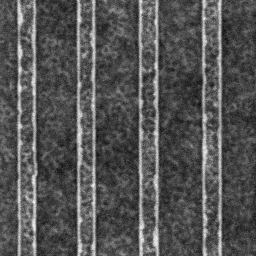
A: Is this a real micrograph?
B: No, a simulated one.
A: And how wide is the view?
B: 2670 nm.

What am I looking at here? parallel lines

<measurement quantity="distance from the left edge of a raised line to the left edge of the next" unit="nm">645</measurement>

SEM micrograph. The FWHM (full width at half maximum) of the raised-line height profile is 0.175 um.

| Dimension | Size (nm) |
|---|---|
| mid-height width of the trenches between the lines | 481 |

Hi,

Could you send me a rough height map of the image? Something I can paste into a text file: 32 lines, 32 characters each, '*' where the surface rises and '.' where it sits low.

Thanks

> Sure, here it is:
..**......**......**.....**.....
..**......**......**.....**.....
..**......**......**......*.....
..**......**......**......*.....
..**......**......**.....**.....
..**......**......**.....**.....
..**......**......**.....**.....
..**......**......**.....***....
..**......**......**......**....
..**......**......**......**....
..**......**......**......**....
..**......**......**.....***....
..**......**......**.....***....
..**......**......**.....***....
..**......**......**.....***....
..**......**......**.....***....
..**......**......**......**....
..**......**......**......**....
..**......**......**.....***....
..**......**......**.....***....
..**......**......**.....***....
..***.....**......**.....***....
..**......**......**.....***....
..**......**......**.....***....
..**......**......**.....***....
..**......**......**.....***....
..**......**......**.....***....
..**......**......**......**....
..**......**.....***......**....
..**......**.....***......**....
..**......**......**......**....
..**......**......**.....***....